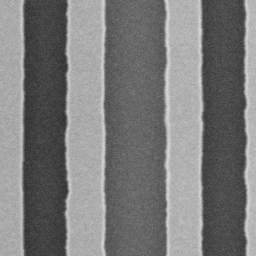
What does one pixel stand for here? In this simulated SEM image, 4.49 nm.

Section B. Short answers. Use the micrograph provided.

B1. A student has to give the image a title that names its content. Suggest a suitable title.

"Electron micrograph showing lines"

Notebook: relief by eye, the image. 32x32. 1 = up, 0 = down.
11100000011110000000011110000001
11100000011110000000011110000001
11100000011110000000011110000001
11100000011110000000011110000001
11100000011110000000011110000001
11100000011110000000011110000001
11100000111110000000011110000001
11100000011110000000011110000001
11100000011110000000011110000001
11100000011110000000011110000001
11100000011110000000011110000001
11100000011110000000011110000001
11100000111110000000011110000001
11100000111110000000011110000001
11100000111110000000011110000001
11100000011110000000011110000001
11100000111110000000011110000001
11100000111110000000011110000001
11100000111110000000011110000001
11100000111110000000011110000001
11100000111110000000011110000001
11100000011110000000011110000001
11100000011110000000011110000001
11100000011110000000011110000001
11100000011110000000011110000001
11100000111110000000011110000001
11100000111110000000011110000001
11100000111110000000011110000001
11100000111110000000011110000001
11100000011110000000011110000001
11100000111110000000011110000001
11100000111110000000011110000001